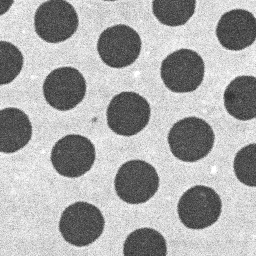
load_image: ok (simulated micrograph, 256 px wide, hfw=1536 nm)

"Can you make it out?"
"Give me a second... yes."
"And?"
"a regular array of holes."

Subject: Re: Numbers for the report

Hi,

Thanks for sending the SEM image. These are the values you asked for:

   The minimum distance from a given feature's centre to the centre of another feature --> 408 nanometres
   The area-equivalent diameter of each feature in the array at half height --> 270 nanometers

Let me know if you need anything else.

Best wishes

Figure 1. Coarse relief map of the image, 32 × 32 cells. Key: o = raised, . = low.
..ooo....oooooooooo.....oooooooo
.ooo......ooooooooo.....oooo...o
oooo......oooooooooo....ooo.....
oooo......ooo...ooooooooooo.....
ooooo....ooo.....oooooooooo.....
..oooooooooo......oooooooooo...o
...ooooooooo......oooo...ooooooo
...oooooooooo....ooo.....ooooooo
...oooo..ooooo.ooooo......oooooo
..oooo....oooooooooo.....ooooo..
.oooo......ooooooooo.....oooo...
ooooo......oooo..ooooo..oooo....
oooooo....oooo....oooooooooo....
o.ooooo..oooo......ooooooooo....
...oooooooooo......oooooooooo...
....ooooooooo.....oooo....oooooo
....oooooooooo...oooo......ooooo
....ooo....oooooooooo......ooooo
...oooo.....ooooooooo......ooo..
oooooo......oooooooooo....ooo...
oooooo......ooo....oooooooooo...
ooooooo....oooo.....ooooooooo...
oooooooooooooo......oooooooooo..
oooooooooooooo......oooo..oooooo
ooooooooooooooo....oooo....ooooo
ooooooooo..ooooo.ooooo......oooo
oooooooo.....ooooooooo......oooo
ooooooo......oooooooooo....ooooo
ooooooo......ooooo.oooo...oooooo
oooooooo.....ooo....oooooooooooo
ooooooooo..oooo......ooooooooooo
ooooooooooooooo......ooooooooooo